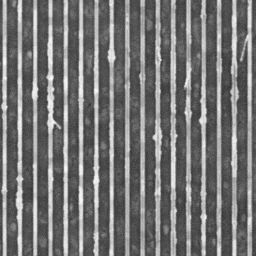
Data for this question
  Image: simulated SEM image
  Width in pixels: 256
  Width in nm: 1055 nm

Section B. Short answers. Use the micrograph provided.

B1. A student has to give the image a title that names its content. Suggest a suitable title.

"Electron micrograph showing parallel lines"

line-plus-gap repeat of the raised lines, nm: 63.1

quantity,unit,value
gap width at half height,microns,0.0489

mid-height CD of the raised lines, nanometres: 13.9